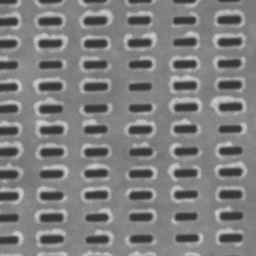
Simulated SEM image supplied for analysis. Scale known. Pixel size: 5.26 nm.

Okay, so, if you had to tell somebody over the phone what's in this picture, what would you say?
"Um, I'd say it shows a regular array of holes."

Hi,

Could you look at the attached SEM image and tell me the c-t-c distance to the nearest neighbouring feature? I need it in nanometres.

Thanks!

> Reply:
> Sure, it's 113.